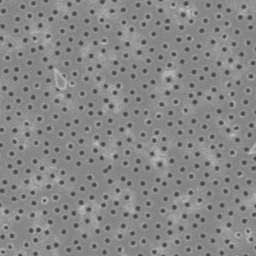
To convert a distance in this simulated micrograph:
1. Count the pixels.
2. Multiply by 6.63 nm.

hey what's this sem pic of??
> a regular array of holes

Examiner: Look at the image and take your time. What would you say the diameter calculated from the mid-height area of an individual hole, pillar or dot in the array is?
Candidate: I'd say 4.8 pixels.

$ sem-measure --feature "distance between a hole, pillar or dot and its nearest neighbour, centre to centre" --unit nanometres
69.9